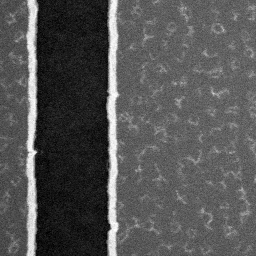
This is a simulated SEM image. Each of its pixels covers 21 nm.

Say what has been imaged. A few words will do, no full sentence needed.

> one or a few lines or trenches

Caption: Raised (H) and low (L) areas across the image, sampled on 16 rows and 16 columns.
HHLLLLLHHHHHHHHH
HHLLLLLHHHHHHHHH
HHLLLLLHHHHHHHHH
HHLLLLLHHHHHHHHH
HHLLLLLHHHHHHHHH
HHLLLLLHHHHHHHHH
HHLLLLLHHHHHHHHH
HHLLLLLHHHHHHHHH
HHLLLLLHHHHHHHHH
HHLLLLLHHHHHHHHH
HHLLLLLHHHHHHHHH
HHLLLLLHHHHHHHHH
HHLLLLLHHHHHHHHH
HHLLLLLHHHHHHHHH
HHLLLLLHHHHHHHHH
HHLLLLLHHHHHHHHH